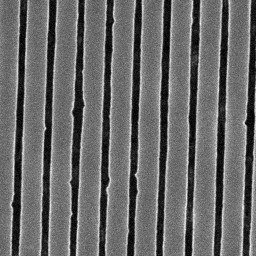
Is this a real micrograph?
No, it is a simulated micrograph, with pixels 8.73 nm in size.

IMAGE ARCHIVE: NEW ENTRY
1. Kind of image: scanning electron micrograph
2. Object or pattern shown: parallel lines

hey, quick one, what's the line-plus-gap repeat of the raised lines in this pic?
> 252 nm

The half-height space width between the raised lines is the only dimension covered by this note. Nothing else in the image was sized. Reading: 69.8 nm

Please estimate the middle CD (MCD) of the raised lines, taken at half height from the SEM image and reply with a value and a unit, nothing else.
0.182 µm